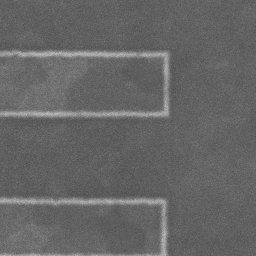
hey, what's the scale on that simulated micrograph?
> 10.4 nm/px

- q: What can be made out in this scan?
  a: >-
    one or a few lines or trenches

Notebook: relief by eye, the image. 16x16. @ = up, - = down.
----------------
----------------
----------------
@@@@@@@@@@------
@@@@@@@@@@------
@@@@@@@@@@------
@@@@@@@@@@------
----------------
----------------
----------------
----------------
----------------
----------------
@@@@@@@@@@------
@@@@@@@@@@------
@@@@@@@@@@------